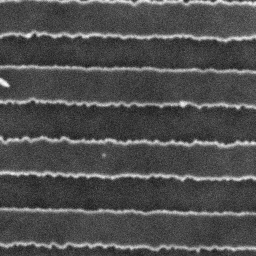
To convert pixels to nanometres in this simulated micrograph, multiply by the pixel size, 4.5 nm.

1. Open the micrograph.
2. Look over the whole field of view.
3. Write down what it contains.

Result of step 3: lines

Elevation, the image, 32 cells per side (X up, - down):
XXXXXXXXXXXXXXXXXXXXXXXXXXXXXXXX
XXXXXXXXXXXXXXXXXXXXXXXXXXXXXXXX
XXXXXXXXXXXXXXXXXXXXXXXXXXXXXXXX
XXXXXXXXXXXXXXXXXXXXXXXXXXXXXXXX
X--X--X-XXX--XXXXXXXXXXXXXXXXXXX
--------------------------------
--------------------------------
--------------------------------
XXXXXXXXXXXXX-XXXXX-------------
XXXXXXXXXXXXXXXXXXXXXXXXXXXXXXXX
XXXXXXXXXXXXXXXXXXXXXXXXXXXXXXXX
XXXXXXXXXXXXXXXXXXXXXXXXXXXXXXXX
XXXXXXXXXXXXXXXXXXXXXXXXXXXXXXXX
--------------------------------
--------------------------------
--------------------------------
--------------------------------
XXXXXXXXX----X------------------
XXXXXXXXXXXXXXXXXXXXXXXXXXXXXXXX
XXXXXXXXXXXXXXXXXXXXXXXXXXXXXXXX
XXXXXXXXXXXXXXXXXXXXXXXXXXXXXXXX
XXXXXXXXXXXXXXXXXXXXXXXXXXXXXXXX
-----------------------------X--
--------------------------------
--------------------------------
--------------------------------
XXXXXXXXXXXXXXXXXX-XXX----------
XXXXXXXXXXXXXXXXXXXXXXXXXXXXXXXX
XXXXXXXXXXXXXXXXXXXXXXXXXXXXXXXX
XXXXXXXXXXXXXXXXXXXXXXXXXXXXXXXX
XXXXXXXXXXXXXXXXXXXXXXXXXXXXXXXX
--------------------------------